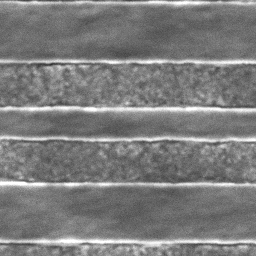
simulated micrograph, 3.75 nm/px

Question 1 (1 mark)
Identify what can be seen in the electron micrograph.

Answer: lines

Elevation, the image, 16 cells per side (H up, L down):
HHHHHHHHHHHHHHHH
HHHHHHHHHHHHHHHH
HHHHHHHHHHHHHHHH
HHHHHHHHHHHHHHHH
LLLLLLLLLLLLLLLL
LLLLLLLLLLLLLLLL
LLLLLLLLLLLLLLLL
HHHHHHHHHHHHHHHH
HHHHHHHHHHHHHHHH
LLLLLLLLLLLLLLLL
LLLLLLLLLLLLLLLL
HHHHHHHHHHHHHHHH
HHHHHHHHHHHHHHHH
HHHHHHHHHHHHHHHH
HHHHHHHHHHHHHHHH
LLLLLLLLLLLLLLLL